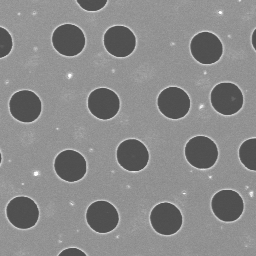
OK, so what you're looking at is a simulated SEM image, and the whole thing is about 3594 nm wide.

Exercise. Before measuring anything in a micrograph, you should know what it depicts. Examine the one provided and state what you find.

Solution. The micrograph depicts a regular array of holes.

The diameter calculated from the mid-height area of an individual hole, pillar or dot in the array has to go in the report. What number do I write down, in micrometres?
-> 0.455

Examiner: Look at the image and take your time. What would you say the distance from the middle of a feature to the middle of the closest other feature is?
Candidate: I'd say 830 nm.